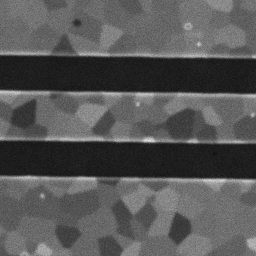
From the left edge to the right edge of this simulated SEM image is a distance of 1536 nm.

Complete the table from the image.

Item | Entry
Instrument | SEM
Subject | wiring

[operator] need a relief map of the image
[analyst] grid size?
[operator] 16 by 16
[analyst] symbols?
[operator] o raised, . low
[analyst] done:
oooooooooooooooo
oooooooooooooooo
oooooooooooooooo
........oooooooo
................
................
oooooooooooooooo
oooooooooooooooo
oooooooooooooooo
................
................
oooooooooooooooo
oooooooooooooooo
oooooooooooooooo
oooooooooooooooo
oooooooooooooooo